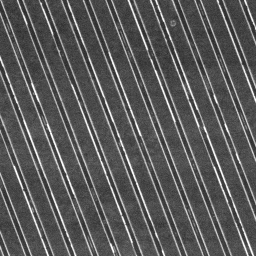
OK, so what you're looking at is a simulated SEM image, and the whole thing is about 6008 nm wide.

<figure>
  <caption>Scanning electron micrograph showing parallel lines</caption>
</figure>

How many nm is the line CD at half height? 362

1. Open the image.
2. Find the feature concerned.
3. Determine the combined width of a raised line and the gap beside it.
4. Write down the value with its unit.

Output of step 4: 0.487 micrometres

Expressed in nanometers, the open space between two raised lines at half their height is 121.